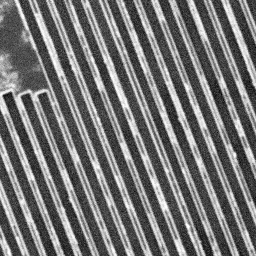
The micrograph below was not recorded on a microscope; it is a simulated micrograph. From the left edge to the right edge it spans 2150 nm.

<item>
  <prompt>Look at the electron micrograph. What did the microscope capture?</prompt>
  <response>parallel lines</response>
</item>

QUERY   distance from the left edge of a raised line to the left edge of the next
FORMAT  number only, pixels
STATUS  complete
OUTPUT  16.3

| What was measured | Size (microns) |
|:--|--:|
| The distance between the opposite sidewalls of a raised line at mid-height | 0.0431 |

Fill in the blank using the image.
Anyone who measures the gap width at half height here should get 97.9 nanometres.